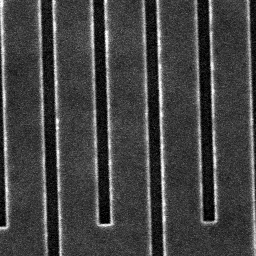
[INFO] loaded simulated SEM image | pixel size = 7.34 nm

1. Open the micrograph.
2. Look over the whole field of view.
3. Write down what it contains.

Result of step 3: parallel lines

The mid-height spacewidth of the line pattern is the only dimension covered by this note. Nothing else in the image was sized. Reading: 12.4 pixels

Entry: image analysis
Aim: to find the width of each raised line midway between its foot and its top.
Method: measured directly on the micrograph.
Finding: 294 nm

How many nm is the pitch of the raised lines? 383